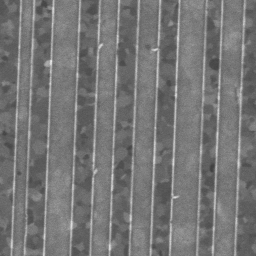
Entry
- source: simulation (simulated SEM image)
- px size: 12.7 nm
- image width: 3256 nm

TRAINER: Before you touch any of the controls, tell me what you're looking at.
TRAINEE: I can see parallel lines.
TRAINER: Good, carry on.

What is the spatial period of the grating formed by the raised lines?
0.543 microns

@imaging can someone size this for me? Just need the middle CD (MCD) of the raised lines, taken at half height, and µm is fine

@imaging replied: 0.254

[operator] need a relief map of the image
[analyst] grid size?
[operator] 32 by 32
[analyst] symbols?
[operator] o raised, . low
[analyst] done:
ooo.ooo...oo...oo...oo....oo...o
ooo.ooo...oo...oo...oo....oo...o
oo..ooo...oo...oo...oo....oo...o
oo..oo....oo...oo...oo....oo...o
oo..oo....oo...oo...oo....oo..oo
oo..oo....oo...oo...oo....oo..oo
oo..oo....oo...oo...oo....oo..oo
oo..oo....oo...oo...oo....oo..oo
oo..oo....oo...oo...oo....o...oo
oo..oo....oo...oo...oo....o...oo
oo..oo....oo...oo...oo...oo...oo
oo..oo....oo..ooo...oo...oo...oo
oo..oo....oo..ooo...oo...oo...oo
oo..oo....oo..ooo...oo...oo...oo
oo..oo...ooo..ooo..ooo...oo...oo
oo..oo...ooo..ooo..ooo...oo...oo
oo..oo...ooo..ooo..ooo...oo...oo
oo..oo...ooo..ooo..ooo...oo...oo
oo..oo...ooo..ooo..ooo...oo...oo
oo..oo...ooo..ooo..ooo...oo...oo
oo..oo...ooo..ooo..ooo...oo...oo
oo..oo...ooo..ooo..ooo...oo...oo
oo.ooo...ooo..oo...ooo...oo...oo
oo.ooo...ooo..oo...ooo...oo...oo
oo.ooo...ooo..oo...ooo...oo...oo
oo.ooo...oo...oo...oo....oo...oo
oo.ooo...oo...oo...oo....oo...oo
oo.ooo...oo...oo...oo....oo...oo
o..ooo...oo...oo...oo....oo...oo
o..oo....oo...oo...oo....oo...oo
o..oo....oo...oo...oo....oo..ooo
o..oo....oo...oo...oo....oo..ooo